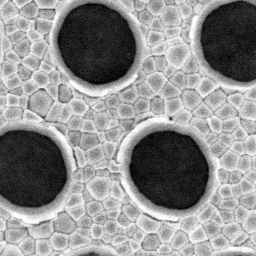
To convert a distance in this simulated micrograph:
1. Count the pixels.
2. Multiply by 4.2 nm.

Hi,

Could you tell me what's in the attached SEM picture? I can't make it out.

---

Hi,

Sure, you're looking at holes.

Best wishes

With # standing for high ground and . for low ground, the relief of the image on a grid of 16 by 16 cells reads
####...######...
####....####....
###......###....
####.....###....
####....#####...
################
################
################
...######...####
....####.....###
....####.....###
....####.....###
....#####....###
################
################
################